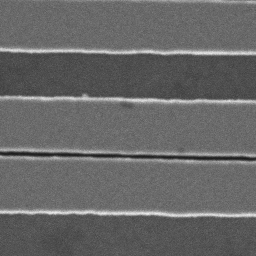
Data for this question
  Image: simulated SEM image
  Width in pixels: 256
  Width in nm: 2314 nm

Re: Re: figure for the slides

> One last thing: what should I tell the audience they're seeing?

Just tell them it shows lines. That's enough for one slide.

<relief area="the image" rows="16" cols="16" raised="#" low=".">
################
################
################
................
................
................
################
################
################
################
################
################
################
..........######
................
................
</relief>